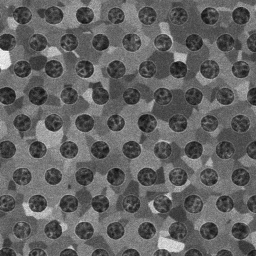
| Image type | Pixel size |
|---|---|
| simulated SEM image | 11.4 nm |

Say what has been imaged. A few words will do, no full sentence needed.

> a regular array of holes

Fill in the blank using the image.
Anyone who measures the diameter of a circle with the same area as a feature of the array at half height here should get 0.201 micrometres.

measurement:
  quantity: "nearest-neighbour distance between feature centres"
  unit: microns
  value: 0.351